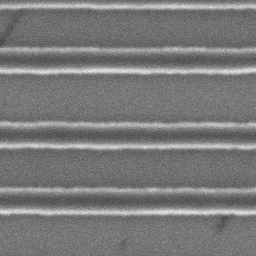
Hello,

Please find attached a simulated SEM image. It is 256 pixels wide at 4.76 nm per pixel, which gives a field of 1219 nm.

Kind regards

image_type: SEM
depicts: lines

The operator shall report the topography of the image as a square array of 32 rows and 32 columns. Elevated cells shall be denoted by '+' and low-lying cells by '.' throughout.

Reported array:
++++++++++++++++++++++++++++++++
................................
................................
................................
................................
................................
++++++++++++++++++++++++++++++++
++++++++++++++++++++++++++++++++
++++++++++++++++++++++++++++++++
................................
................................
................................
................................
................................
................................
++++++++++++++++++++..+++++++..+
++++++++++++++++++++++++++++++++
++++++++++++++++++++++++++++++++
............+.................++
................................
................................
................................
................................
...+............................
++++++++++++++++++++++++++++++++
++++++++++++++++++++++++++++++++
++++++++++++++++++++++++++++++++
................................
................................
................................
................................
................................